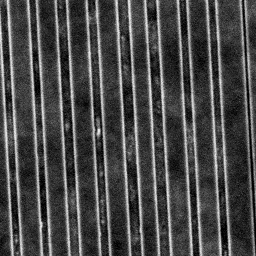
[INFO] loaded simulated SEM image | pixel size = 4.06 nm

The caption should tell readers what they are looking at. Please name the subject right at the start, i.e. parallel lines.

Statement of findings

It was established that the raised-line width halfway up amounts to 86.2 nm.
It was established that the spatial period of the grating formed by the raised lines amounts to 122 nm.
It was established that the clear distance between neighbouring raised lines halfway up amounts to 7.73 px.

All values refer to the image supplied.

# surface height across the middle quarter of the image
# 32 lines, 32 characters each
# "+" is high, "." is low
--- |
.++++++..+++++...++++...+++++...
..+++++..+++++...++++...++++++..
..+++++..+++++...++++...++++++..
..+++++..+++++...++++...++++++..
..+++++..+++++...++++...++++++..
..+++++..+++++...+++++..++++++..
..+++++..+++++...+++++..++++++..
..+++++..+++++....++++...+++++..
..+++++..+++++....++++...+++++..
..+++++..++++++...++++...+++++..
..+++++...+++++...++++...+++++..
..+++++...+++++...++++...+++++..
..+++++...+++++...++++...+++++..
..+++++...+++++...++++...+++++..
..+++++.+.+++++...++++...+++++..
..+++++...+++++...++++...+++++..
..++++++..+++++...++++...+++++..
..++++++..+++++...++++...+++++..
..++++++..+++++...++++...+++++..
...+++++..+++++...++++...++++++.
...+++++..+++++...++++...++++++.
...+++++..+++++...++++...++++++.
...+++++..+++++...++++...++++++.
...+++++..+++++...+++++..++++++.
...+++++..+++++...+++++..++++++.
...+++++..+++++...+++++..++++++.
...+++++..+++++....++++...+++++.
...+++++..++++++...++++...+++++.
...+++++..++++++...++++...+++++.
...+++++...+++++...++++...+++++.
...+++++...+++++...++++...+++++.
+..+++++...+++++...++++...+++++.